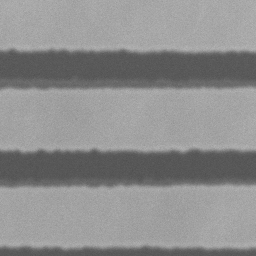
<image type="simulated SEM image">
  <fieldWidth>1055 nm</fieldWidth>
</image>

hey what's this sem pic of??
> lines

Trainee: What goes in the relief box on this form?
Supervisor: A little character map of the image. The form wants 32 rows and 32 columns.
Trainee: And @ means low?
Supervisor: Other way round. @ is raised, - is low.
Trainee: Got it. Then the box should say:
@@@@@@@@@@@@@@@@@@@@@@@@@@@@@@@@
@@@@@@@@@@@@@@@@@@@@@@@@@@@@@@@@
@@@@@@@@@@@@@@@@@@@@@@@@@@@@@@@@
@@@@@@@@@@@@@@@@@@@@@@@@@@@@@@@@
@@@@@@@@@@@@@@@@@@@@@@@@@@@@@@@@
@@@@@@@@@@@@@@@@@@@@@@@@@@@@@@@@
-----------------@-----@@-------
--------------------------------
--------------------------------
--------------------------------
--------------------------------
@@@@@@@@@@@@@@@@@@@@@@@@@@@@@@@@
@@@@@@@@@@@@@@@@@@@@@@@@@@@@@@@@
@@@@@@@@@@@@@@@@@@@@@@@@@@@@@@@@
@@@@@@@@@@@@@@@@@@@@@@@@@@@@@@@@
@@@@@@@@@@@@@@@@@@@@@@@@@@@@@@@@
@@@@@@@@@@@@@@@@@@@@@@@@@@@@@@@@
@@@@@@@@@@@@@@@@@@@@@@@@@@@@@@@@
@@@@@@@@@@@@@@@@@@@@@@@@@@@@@@@@
--------------------------------
--------------------------------
--------------------------------
--------------------------------
@@@@@@@@@@@@@@@@@@@@@@@@@@@@@@@@
@@@@@@@@@@@@@@@@@@@@@@@@@@@@@@@@
@@@@@@@@@@@@@@@@@@@@@@@@@@@@@@@@
@@@@@@@@@@@@@@@@@@@@@@@@@@@@@@@@
@@@@@@@@@@@@@@@@@@@@@@@@@@@@@@@@
@@@@@@@@@@@@@@@@@@@@@@@@@@@@@@@@
@@@@@@@@@@@@@@@@@@@@@@@@@@@@@@@@
@@@@@@@@@@@@@@@@@@@@@@@@@@@@@@@@
--------------------------------